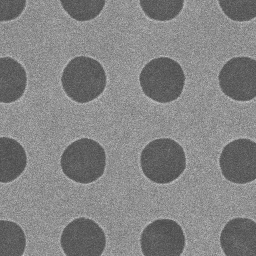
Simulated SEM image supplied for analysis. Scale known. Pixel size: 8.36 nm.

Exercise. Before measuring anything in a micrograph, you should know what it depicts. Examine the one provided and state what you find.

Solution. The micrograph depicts holes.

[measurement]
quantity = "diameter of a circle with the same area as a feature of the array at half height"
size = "380 nm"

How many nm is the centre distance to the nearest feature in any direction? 660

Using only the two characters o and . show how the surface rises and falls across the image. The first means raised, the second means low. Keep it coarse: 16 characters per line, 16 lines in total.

.ooo..ooo..ooo..
oooooooooooooooo
oooooooooooooooo
oooooooooooooooo
..oo...oo..ooo..
..oo...oo..ooo..
oooooooooooooooo
oooooooooooooooo
oooooooooooooooo
..oo...oo..ooo..
..oo...oo...oo..
oooooooooooooooo
oooooooooooooooo
oooooooooooooooo
.ooo..ooo..ooo..
..oo..ooo..ooo..